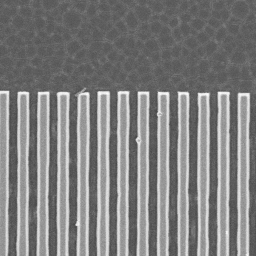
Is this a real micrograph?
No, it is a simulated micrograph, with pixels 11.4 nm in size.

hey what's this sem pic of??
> parallel lines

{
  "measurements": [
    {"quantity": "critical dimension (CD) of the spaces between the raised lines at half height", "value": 119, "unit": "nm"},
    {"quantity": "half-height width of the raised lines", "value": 108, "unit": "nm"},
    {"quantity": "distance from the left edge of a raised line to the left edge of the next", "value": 228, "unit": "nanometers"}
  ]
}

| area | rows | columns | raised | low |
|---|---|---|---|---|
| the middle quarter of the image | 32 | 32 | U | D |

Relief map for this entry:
DDDDDDDDDDDDDDDDDDDDDDDDDDDDDDDD
DDDDDDDDDDDDDDDDDDDDDDDDDDDDDDDD
DDDDDDDDDDDDDDDDDDDDDDDDDDDDDDDD
DDDDDDDDDDDDDDDDDDDDDDDDDDDDDDDD
DDDDDDDDDDDDDDDDDDDDDDDDDDDDDDDD
DDDDDDDDDDDDDDDDDDDDDDDDDDDDDDDD
DDDDDDDDDDDDDDDDDDDDDDDDDDDDDDDD
UDDDUDDDDUUDDDUUDDDUUDDDUUDDDUUD
UDDDUUDDDUUDDDUUDDDUUDDDUUDDDUUD
UDDDUUDDDUUDDDUUDDDUUDDDUUDDDUUD
UDDDUUDDDUUDDDUUDDDUUDDDUUDDDUUD
UDDDUUDDDUUDDDUUDDDUUDDDUUDDDUUD
UDDDUUDDDUUDDDUUDDDUUDDUUUDDDUUD
UDDDUUDDDUUDDDUUDDDUUDDDUUDDDUUD
UDDDUUDDDUUDDDUUDDDUUDDDUUDDDUUD
UDDDUUDDDUUDDDUUDDDUUDDDUUDDDUUD
UDDDUUDDDUUDDDUUDDDUUDDDUUDDDUUD
UDDDUUDDDUUDDDUUDDDUUDDDUUDDDUUD
UDDDUUDDDUUDDDUUDDUUUDDDUUDDDUUD
UDDDUUDDDUUDDDUUDDUUUDDDUUDDDUUD
UDDDUUDDDUUDDDUUDDDUUDDDUUDDDUUD
UDDDUUDDDUUDDDUUDDDUUDDDUUDDDUUD
UDDDUUDDDUUDDDUUDDDUUDDDUUDDDUUD
UDDDUUDDDUUDDDUUDDDUUDDDUUDDDUUD
UDDDUUDDDUUDDDUUDDDUUDDDUUDDDUUD
UDDDUUDDDUUDDDUUDDDUUDDDUUDDDUUD
UDDDUUDDDUUDDDUUDDDUUDDDUUDDDUUD
UDDDUUDDDUUDDDUUDDDUUDDDUUDDDUUD
UDDDUUDDDUUDDDUUDDDUUDDDUUDDDUUD
UDDDUUDDDUUDDDUUDDDUUDDDUUDDDUUD
UDDDUUDDDUUDDDUUDDDUUDDDUUDDDUUD
UDDDUUDDDUUDDDUUDDDUUDDDUUDDDUUD